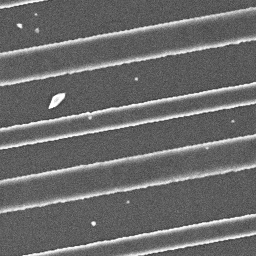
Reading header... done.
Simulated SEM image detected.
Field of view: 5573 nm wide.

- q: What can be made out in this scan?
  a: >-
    lines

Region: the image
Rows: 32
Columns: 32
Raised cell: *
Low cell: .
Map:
***.............................
.............................***
.......................*********
..................**************
............********************
.......**********************...
.**********************.........
******************..............
************....................
*******.........................
*..............................*
.........................*******
.......*............************
..............***************...
.........**************.........
...***************..............
************....................
*******.....................****
*......................*********
.................***************
...........*********************
......**********************....
.**********************.........
******************..............
************....................
******..........................
................................
............................****
......................**********
.................**************.
...........**************.......
......**************............